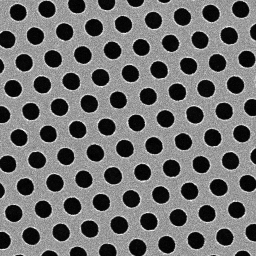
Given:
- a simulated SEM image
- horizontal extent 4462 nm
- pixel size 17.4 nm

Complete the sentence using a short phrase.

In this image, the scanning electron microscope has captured a regular array of holes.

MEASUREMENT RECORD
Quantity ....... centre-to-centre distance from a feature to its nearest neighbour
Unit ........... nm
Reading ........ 498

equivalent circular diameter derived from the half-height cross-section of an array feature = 306 nanometers